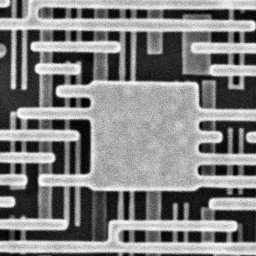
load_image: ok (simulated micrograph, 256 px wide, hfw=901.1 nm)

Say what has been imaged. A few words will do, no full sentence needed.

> wiring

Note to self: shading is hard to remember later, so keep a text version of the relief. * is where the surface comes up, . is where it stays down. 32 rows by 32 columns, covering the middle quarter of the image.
****............................
****............................
.**.............................
................................
.......*****************........
********************************
********************************
********************************
......**************************
.......*************************
......**************************
********************************
********************************
********************************
.......*************************
.......*************************
.......*************************
****...*************************
****...*************************
.......*************************
.......*************************
.......*************************
.......*************************
.......*************************
.......*************************
.......*************************
.......*************************
......**************************
********************************
********************************
.....***************************
.......*************************